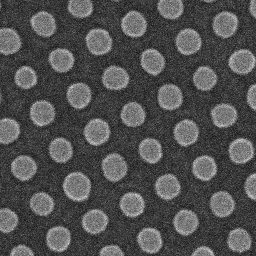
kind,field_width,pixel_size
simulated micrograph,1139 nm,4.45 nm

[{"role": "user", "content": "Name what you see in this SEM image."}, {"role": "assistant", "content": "a regular array of raised bodies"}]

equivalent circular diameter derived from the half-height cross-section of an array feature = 106 nanometres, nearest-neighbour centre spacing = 176 nm